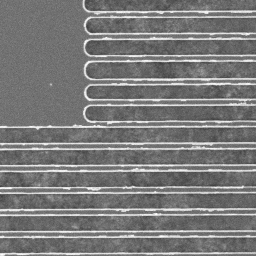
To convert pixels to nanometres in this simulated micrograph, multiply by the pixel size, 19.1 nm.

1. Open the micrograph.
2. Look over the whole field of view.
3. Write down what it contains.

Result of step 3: parallel lines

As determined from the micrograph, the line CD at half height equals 115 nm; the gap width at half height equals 310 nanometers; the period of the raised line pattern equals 22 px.